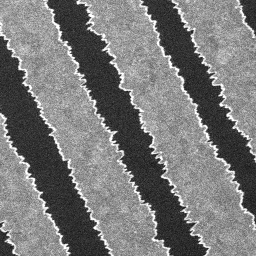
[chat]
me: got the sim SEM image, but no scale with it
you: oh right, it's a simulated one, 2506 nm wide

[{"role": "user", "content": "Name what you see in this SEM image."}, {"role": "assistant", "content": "one or a few lines or trenches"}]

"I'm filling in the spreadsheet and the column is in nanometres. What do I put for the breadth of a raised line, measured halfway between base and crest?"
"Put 507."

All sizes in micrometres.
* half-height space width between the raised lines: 0.334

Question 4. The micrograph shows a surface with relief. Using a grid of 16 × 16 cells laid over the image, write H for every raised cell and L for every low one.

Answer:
HHHLLHHHHLLHHHHL
HHHLLLHHHHLLHHHL
HHHHLLHHHHLLHHHH
LHHHHLLHHHLLLHHH
LHHHHLLHHHHLLHHH
LLHHHLLLHHHHLLHH
LLHHHHLLHHHHLLHH
LLLHHHLLLHHHHLLH
LLLHHHHLLHHHHLLH
HLLLHHHLLLHHHLLL
HHLLHHHHLLHHHHLL
HHLLLHHHLLLHHHHL
HHHLLHHHHLLHHHHL
HHHLLLHHHHLLHHHH
HHHHLLHHHHLLHHHH
LHHHLLLHHHLLLHHH